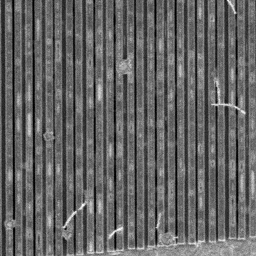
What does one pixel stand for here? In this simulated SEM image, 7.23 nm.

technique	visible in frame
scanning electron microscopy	parallel lines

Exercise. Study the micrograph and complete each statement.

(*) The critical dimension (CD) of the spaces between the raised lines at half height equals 26.2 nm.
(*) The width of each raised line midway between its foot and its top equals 46.1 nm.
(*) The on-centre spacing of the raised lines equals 73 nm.